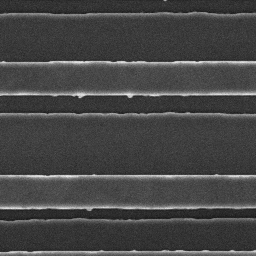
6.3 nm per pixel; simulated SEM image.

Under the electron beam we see lines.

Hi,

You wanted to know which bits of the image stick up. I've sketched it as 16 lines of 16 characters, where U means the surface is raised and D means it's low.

DDDDDDDDDDDDDDDD
DDDDDDDDDDDDDDDD
DDDDDDDDDDDDDDDD
DDDDDDDDDDDDDDDD
UUUUUUUUUUUUUUUU
UUUUUUUUUUUUUUUU
DDDDDDDDDDDDDDDD
DDDDDDDDDDDDDDDD
DDDDDDDDDDDDDDDD
DDDDDDDDDDDDDDDD
DDDDDDDDDDDDDDDD
UUUUUUUUUUUUUUUU
UUUUUUUUUUUUUUUU
DDDDDDDDDDDDDDDD
DDDDDDDDDDDDDDDD
DDDDDDDDDDDDDDDD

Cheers